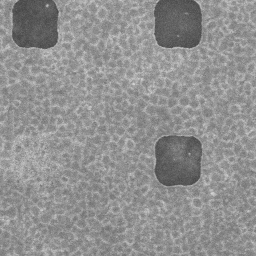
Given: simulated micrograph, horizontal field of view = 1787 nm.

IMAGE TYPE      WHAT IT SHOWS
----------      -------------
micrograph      holes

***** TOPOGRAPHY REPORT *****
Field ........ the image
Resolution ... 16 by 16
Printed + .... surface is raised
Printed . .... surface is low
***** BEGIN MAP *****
+...++++++...+++
+...++++++...+++
+...++++++...+++
++++++++++++++++
++++++++++++++++
++++++++++++++++
++++++++++++++++
++++++++++++++++
++++++++++..++++
++++++++++...+++
++++++++++...+++
++++++++++..++++
++++++++++++++++
++++++++++++++++
++++++++++++++++
++++++++++++++++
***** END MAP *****